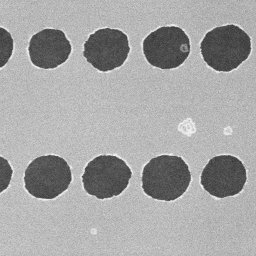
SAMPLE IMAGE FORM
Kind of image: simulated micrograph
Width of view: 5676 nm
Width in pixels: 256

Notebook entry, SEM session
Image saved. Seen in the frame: a regular array of holes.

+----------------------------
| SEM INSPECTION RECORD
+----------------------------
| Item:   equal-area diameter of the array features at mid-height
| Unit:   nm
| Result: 1010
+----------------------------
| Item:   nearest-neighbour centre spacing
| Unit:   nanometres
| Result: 1290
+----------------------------